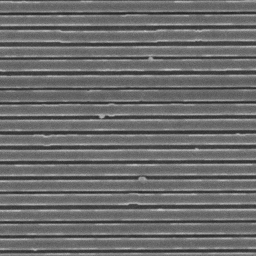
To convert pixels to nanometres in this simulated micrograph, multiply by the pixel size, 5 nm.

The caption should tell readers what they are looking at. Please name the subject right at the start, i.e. parallel lines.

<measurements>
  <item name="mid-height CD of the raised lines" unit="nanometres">52.5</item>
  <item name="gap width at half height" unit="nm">21.2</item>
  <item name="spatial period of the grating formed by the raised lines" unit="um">0.0742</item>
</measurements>